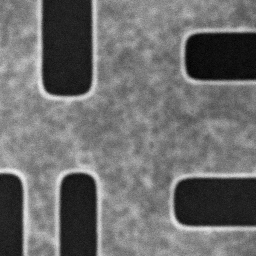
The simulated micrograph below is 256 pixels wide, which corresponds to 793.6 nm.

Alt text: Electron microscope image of groups of lines, slits or small figures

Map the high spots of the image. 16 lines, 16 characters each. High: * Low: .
**....**********
**....**********
***...******....
***...*****.....
**....******....
***...**********
****************
****************
****************
****************
****************
..**..*****.....
..**..*****.....
..**..*****.....
..**..**********
..**..**********